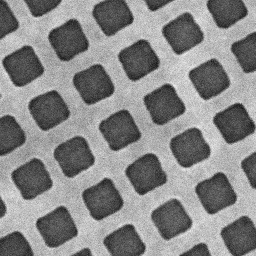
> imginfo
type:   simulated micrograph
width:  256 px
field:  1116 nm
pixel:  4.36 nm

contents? a regular array of holes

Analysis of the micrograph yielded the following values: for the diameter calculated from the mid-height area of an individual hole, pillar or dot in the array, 39 pixels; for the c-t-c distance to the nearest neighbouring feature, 222 nanometers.